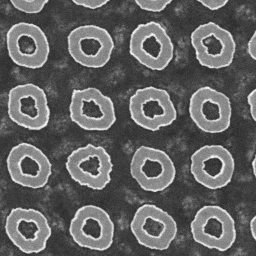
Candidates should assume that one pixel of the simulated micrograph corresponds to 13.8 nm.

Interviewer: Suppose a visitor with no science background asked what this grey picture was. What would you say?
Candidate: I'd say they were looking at a regular array of ring-shaped raised bodies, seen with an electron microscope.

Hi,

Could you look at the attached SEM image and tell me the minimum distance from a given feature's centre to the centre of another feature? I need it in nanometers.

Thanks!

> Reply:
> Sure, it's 819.